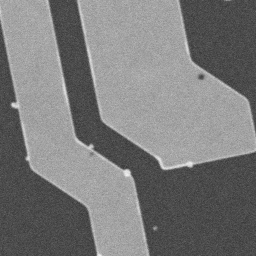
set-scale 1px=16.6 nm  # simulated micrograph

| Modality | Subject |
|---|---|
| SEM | groups of lines, slits or small figures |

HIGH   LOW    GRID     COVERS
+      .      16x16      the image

+++..++++++.....
+++..++++++.....
+++..+++++++....
++++..++++++....
.+++..+++++++...
.+++..++++++++..
.+++..++++++++++
.+++..++++++++++
..+++...++++++++
..++++...+++++++
..++++++........
...+++++........
.....++++.......
......+++.......
......+++.......
......+++.......